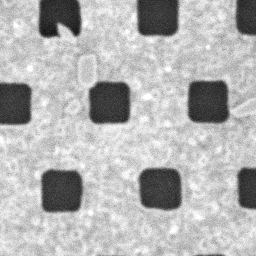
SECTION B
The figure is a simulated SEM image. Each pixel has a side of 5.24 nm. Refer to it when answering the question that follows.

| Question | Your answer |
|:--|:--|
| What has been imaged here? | holes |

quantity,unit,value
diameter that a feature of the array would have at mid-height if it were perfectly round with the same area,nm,246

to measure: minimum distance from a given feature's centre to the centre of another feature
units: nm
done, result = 517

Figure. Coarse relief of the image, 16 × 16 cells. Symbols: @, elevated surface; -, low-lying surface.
@@---@@@@--@@@@-
@@---@@@@--@@@@-
@@@@@@@@@@@@@@@@
@@@@@@@@@@@@@@@@
@@@@@@@@@@@@@@@@
--@@@@--@@@@--@@
--@@@@--@@@@--@@
--@@@@--@@@@--@@
@@@@@@@@@@@@@@@@
@@@@@@@@@@@@@@@@
@@@@@@@@@@-@@@@-
@@@--@@@@--@@@@-
@@@--@@@@--@@@@-
@@@@@@@@@@@@@@@@
@@@@@@@@@@@@@@@@
@@@@@@@@@@@@@@@@